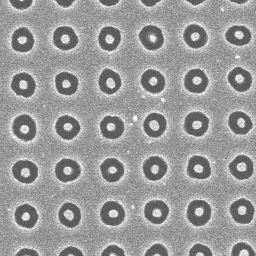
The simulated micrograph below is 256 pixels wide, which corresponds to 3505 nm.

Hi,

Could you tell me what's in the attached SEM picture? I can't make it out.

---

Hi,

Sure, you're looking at a regular array of ring-shaped grooves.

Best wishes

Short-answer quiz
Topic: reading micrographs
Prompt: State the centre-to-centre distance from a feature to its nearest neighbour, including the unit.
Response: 0.583 micrometres